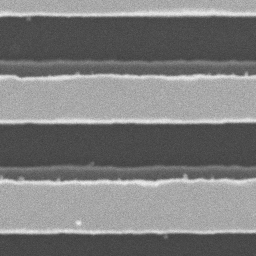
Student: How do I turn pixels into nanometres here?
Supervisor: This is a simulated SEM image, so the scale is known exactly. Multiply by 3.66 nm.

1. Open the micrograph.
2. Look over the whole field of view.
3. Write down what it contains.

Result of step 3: lines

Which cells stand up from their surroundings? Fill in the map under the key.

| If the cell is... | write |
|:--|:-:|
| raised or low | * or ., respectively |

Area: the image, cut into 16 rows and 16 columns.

****************
................
................
................
................
****************
****************
****************
................
................
................
****************
****************
****************
****************
................